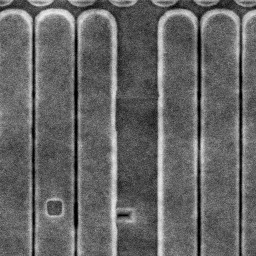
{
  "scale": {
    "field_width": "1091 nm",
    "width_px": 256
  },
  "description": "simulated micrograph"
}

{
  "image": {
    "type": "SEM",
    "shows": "wiring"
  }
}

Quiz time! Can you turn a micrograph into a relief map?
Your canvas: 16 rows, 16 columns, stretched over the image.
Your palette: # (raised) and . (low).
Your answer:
................
#######...######
#######...######
#######...######
#######...######
#######...######
#######...######
#######...######
#######...######
#######...######
#######...######
#######...######
#######...######
#######...######
#######...######
#######...######